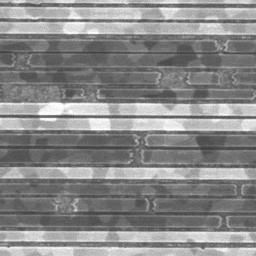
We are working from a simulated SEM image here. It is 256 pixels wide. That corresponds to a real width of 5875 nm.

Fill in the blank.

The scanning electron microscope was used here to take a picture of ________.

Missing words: parallel lines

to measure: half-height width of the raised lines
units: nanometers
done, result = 258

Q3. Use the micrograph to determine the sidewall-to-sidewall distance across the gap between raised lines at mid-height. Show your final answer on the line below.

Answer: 0.1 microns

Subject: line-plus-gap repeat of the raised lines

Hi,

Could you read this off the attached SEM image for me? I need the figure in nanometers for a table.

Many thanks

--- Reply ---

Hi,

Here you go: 366